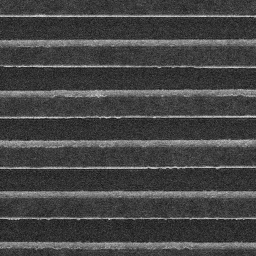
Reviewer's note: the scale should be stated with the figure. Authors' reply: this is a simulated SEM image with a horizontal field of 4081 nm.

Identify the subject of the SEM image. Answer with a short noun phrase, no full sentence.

lines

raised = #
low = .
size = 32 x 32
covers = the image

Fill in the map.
################################
################################
................................
................................
................................
################################
################################
################################
................................
................................
................................
................................
################################
################################
################################
................................
................................
................................
################################
################################
################################
................................
................................
................................
################################
################################
################################
................................
................................
................................
................................
################################